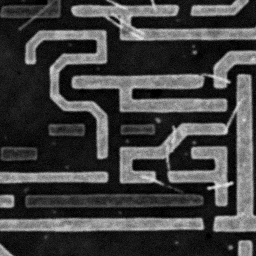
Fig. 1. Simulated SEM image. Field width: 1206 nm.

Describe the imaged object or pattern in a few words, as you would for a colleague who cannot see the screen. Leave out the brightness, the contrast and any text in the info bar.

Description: wiring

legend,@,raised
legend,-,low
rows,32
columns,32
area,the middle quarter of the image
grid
--------------------------------
--------------------------------
--------------------------------
---@@@@@@@@@@@@@@@@@@@@@@@@@@@@@
--@@@@@@@@@@@@@@@@@@@@@@@@@@@@@@
--@@@@@@@@@@@@@@@@@@@@@@@@@@@@@@
--------------@@@---------------
--------------@@@---------------
--------------@@@---------------
@-------------@@@@@@@@@@@@@@@@@@
@@@@@@@@------@@@@@@@@@@@@@@@@@@
------@@@@----@@@@@@@@@@@@@@@@@@
-------@@@@---------------------
--------@@@---------------------
--------@@@---------------------
@@@@@---@@@----@@@@@@@-------@@@
@@@@@---@@@---@@@@@@@@@----@@@@@
@@@@@---@@@----@-----@-----@@@@@
--------@@@---------------@@@@--
--------@@@--------------@@@@---
--------@@@-------------@@@@----
---------@@---@@@@@@@@@@@@@-----
---------@@---@@@@@@@@@@@@------
---------@----@@@@@@@@@@@@------
--------------@@@---------------
--------------@@@---------------
--------------@@@---------------
@@@@@@@@@@@---@@@@@@@@@---@@@@@@
@@@@@@@@@@@---@@@@@@@@@---@@@@@@
--------------@@@@@@@@----------
--------------------------------
--------------------------------